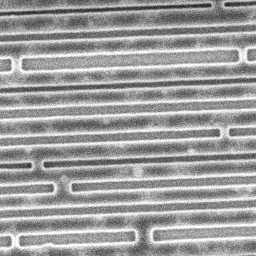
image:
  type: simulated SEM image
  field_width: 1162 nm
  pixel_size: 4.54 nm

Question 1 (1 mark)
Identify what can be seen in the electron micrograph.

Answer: parallel lines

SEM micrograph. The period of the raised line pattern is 0.115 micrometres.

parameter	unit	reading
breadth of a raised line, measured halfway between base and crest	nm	73.8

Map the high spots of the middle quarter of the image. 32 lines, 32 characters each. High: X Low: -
-------------------------XXXXXXX
--XXXXXXXXXXXXXXXXXXXXXXXXXXXXXX
XXXXXXXXXXXXXXXXXXXXXXXXXXXXXXXX
XXXXXXXXXXXXXXXXXXXXXXXXXXXXXXXX
XXXXXXXXXXXXXXXX----------------
--------------------------------
---------XX--XXXXXXXXXXXXXXXXXXX
XXXXXXXXXXXXXXXXXXXXXXXXXXXXXXXX
XXXXXXXXXXXXXXXXXXXXXXXXXXXXXXXX
XXXXXXXXXXXXXXXXXXXXXXX--XX-----
--------------------------------
--------------------------------
-------------------XXXXXXXXXXXXX
XXXXXXXXXXXXXXXXXXXXXXXXXXXXXXXX
XXXXXXXXXXXXXXXXXXXXXXXXXXXXXXXX
XXXXXXXXXXXXXXXXXXXXXXXXXXXXXXXX
XXXXXXXXXXXXXXXXXXXXXXXXXX------
XX------------------------------
--------------------------------
--------------X--XXXXXXXXXXXXXXX
XXXXXXXXXXXXXXXXXXXXXXXXXXXXXXXX
XXXXXXXXXXXXXXXXXXXXXXXXXXXXXXXX
XXXXXXXXXXXXXXXXXXXXXXXXXXXXXXX-
XXXXXXXXXXXXX-------------------
--------------------------------
-----------XXXXXXXXXXXXXXXXXXXXX
XXXXXXXXXXXXXXXXXXXXXXXXXXXXXXXX
XXXXXXXXXXXXXXXXXXXXXXXXXXXXXXXX
XXXXXXXXXXXXXXXXXXXXXXXXX-------
XXX-----------------------------
XX------------------------------
XX---------------XXXXXXXXXXXXXXX